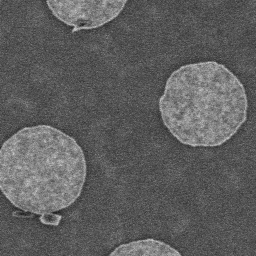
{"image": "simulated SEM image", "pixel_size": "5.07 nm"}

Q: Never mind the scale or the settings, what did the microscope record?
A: raised bodies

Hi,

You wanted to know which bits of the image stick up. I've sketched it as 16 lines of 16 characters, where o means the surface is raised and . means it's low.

...ooooo........
....oo..........
................
................
...........ooo..
..........ooooo.
..........ooooo.
..........ooooo.
.ooo.......ooo..
ooooo...........
ooooo...........
ooooo...........
.oooo...........
..oo............
................
.......oooo.....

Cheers